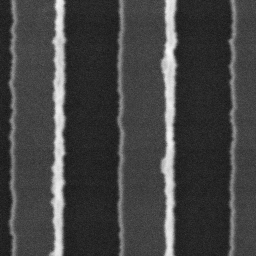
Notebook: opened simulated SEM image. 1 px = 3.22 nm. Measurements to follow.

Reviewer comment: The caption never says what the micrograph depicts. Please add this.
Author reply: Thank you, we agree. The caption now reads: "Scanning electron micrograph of lines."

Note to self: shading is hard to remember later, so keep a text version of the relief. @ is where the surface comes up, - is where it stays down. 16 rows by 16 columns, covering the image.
-@@@----@@@----@
-@@@----@@@----@
-@@@----@@@---@@
-@@@---@@@@----@
-@@@---@@@@---@@
-@@@----@@@---@@
-@@@----@@@----@
-@@@---@@@@---@@
-@@@----@@@----@
-@@@----@@@---@@
-@@@----@@@----@
-@@@----@@@---@@
-@@@----@@@---@@
-@@@----@@@---@@
-@@@----@@@---@@
-@@@----@@@---@@